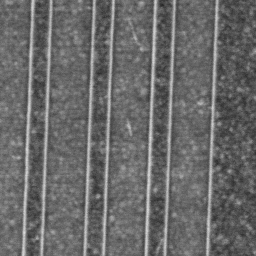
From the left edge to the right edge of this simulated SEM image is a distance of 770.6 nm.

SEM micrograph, one or a few lines or trenches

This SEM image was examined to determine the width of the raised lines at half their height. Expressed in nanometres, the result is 61.7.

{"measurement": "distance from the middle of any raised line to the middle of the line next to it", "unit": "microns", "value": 0.185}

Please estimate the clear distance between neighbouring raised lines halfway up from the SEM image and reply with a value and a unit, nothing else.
123 nanometres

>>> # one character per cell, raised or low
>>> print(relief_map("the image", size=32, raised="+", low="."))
....++......++.....+++.....+++++
....++......++.....+++.....+++++
....++......++.....+++.....+++++
....++......++.....+++.....+++++
....++......++.....+++.....+++++
....++......++.....+++.....+++++
....++.....+++.....+++.....+++++
....++.....+++.....+++.....+++++
....++.....+++.....+++.....+++++
....++.....+++.....+++.....+++++
....++.....+++.....++......+++++
....++.....+++.....++......+++++
....++.....+++.....++......+++++
....++.....+++.....++......+++++
....++.....+++.....++......+++++
...+++.....+++.....++.....++++++
...+++.....+++.....++.....++++++
...+++.....+++.....++.....++++++
...+++.....++......++.....++++++
...+++.....++......++.....++++++
...+++.....++......++.....++++++
...+++.....++......++.....++++++
...+++.....++......++.....++++++
...+++.....++......++.....++++++
...++......++.....+++.....++++++
...+++.....++.....+++.....++++++
...+++.....++.....+++.....++++++
...++......++.....+++.....++++++
...++......++.....+++.....++++++
...++......++.....+++.....++++++
...++......++.....+++.....++++++
...++......++.....+++.....++++++